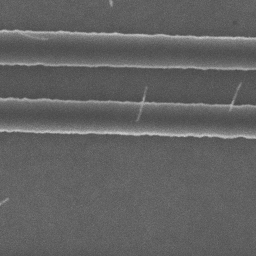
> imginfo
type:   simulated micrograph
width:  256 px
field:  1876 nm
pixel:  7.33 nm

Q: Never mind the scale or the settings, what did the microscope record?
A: lines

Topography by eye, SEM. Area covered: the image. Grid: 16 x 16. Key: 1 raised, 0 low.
0000000000000000
0000000000000000
1111111111111111
1111111111111111
0000000000000000
0000000000000000
1111111111110000
1111111111111111
0000000000001111
0000000000000000
0000000000000000
0000000000000000
0000000000000000
0000000000000000
0000000000000000
0000000000000000